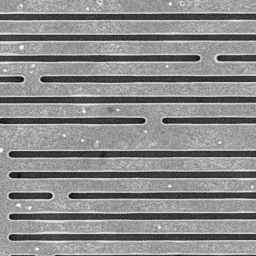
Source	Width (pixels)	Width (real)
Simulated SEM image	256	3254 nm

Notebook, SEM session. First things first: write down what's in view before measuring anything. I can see groups of lines, slits or small figures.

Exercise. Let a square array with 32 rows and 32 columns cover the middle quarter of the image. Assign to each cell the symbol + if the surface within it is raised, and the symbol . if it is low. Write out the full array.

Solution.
++++++++++++++++++++++++++++++++
++++++++++++++++++++++++++++++++
++++++++++++++++++++++++++++++++
................................
................................
++++++++++++++++++++++++++++++++
++++++++++++++++++++++++++++++++
++++++++++++++++++++++++++++++++
................................
................................
++++++++++++++++++++++++++++++++
++++++++++++++++++++++++++++++++
++++++++++++++++++++++++++++++++
....................+++++.......
....................++++........
++++++++++++++++++++++++++++++++
++++++++++++++++++++++++++++++++
++++++++++++++++++++++++++++++++
++++++++++++++++++++++++++++++++
++++++++++++++++++++++++++++++++
++++++++++++++++++++++++++++++++
................................
................................
+++++++......++++++++...++++++++
++++++++++++++++++++++++++++++++
++++++++++++++++++++++++++++++++
++++++++++++++++++++++++++++++++
................................
................................
++++++++++++++++++++++++++++++++
++++++++++++++++++++++++++++++++
++++++++++++++++++++++++++++++++